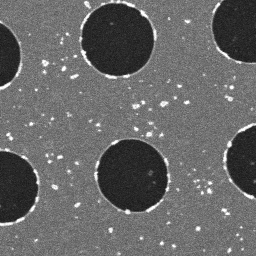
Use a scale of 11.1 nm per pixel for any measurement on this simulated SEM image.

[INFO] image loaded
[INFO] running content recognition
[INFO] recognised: holes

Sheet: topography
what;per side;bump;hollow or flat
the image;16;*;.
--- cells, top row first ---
******..******..
*****....****...
.****.....***...
.****....*****..
.*****..********
****************
****************
****************
***************.
*******...****..
..****....****..
..****....*****.
..*****...******
.***************
****************
****************